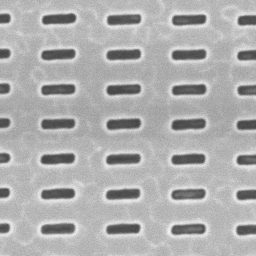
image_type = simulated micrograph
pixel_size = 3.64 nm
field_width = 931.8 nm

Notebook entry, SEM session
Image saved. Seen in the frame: a regular array of holes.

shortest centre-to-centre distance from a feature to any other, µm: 0.127